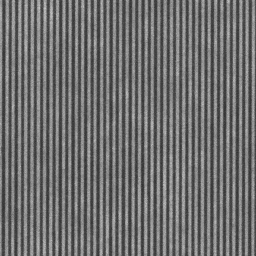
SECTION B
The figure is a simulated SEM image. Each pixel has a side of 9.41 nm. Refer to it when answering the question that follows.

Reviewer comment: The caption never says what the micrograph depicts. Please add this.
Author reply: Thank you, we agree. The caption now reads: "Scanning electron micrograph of parallel lines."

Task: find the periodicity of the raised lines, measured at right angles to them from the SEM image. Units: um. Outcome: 0.0593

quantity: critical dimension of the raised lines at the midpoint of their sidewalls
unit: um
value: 0.027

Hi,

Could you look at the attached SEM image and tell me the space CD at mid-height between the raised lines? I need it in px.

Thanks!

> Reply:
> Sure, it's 3.87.